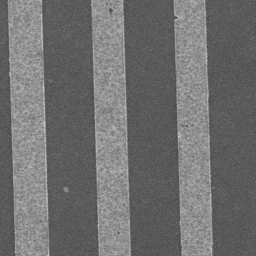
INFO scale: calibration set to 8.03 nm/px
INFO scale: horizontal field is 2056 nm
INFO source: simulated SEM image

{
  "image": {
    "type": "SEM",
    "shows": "one or a few lines or trenches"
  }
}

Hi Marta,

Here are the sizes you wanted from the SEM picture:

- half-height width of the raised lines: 251 nanometres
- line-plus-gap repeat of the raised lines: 0.661 um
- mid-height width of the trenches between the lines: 0.406 um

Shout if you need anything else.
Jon